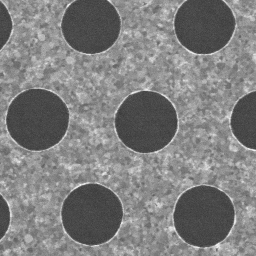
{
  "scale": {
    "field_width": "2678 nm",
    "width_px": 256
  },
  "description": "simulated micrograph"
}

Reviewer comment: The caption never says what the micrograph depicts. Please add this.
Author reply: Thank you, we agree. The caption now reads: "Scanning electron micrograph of holes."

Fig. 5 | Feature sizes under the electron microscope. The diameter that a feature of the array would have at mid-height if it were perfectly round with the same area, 657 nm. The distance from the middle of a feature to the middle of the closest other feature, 1130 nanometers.